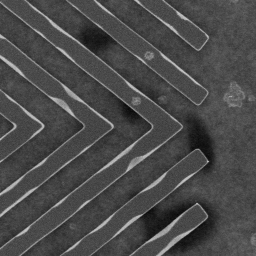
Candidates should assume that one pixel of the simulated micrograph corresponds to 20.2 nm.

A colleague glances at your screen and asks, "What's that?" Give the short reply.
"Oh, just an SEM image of groups of lines, slits or small figures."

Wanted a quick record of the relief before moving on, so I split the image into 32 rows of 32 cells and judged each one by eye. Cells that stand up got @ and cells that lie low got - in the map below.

@@@@-----@@@-----@@@@-----------
-@@@@-----@@@@-----@@@----------
---@@@-----@@@@-----@@@@--------
----@@@------@@@-----@@@@-------
-----@@@@-----@@@-----@@@@------
@@-----@@@-----@@@@-----@@------
@@@-----@@@-----@@@@------------
-@@@-----@@@@-----@@@-----------
--@@@-----@@@@-----@@@----------
---@@@-----@@@@-----@@@@--------
----@@@@-----@@@-----@@@@-------
-----@@@@-----@@@------@@@------
@------@@@-----@@@@-----@-------
@@@-----@@@-----@@@@------------
@@@@-----@@@@-----@@@-----------
--@@@-----@@@@-----@@@@---------
-@@@@-----@@@------@@@----------
@@@@-----@@@-----@@@@-----------
@@-----@@@@-----@@@@------------
@-----@@@@-----@@@-----@@@------
-----@@@------@@@-----@@@@------
----@@@-----@@@@-----@@@@-------
--@@@@-----@@@@-----@@@---------
-@@@@-----@@@------@@@----------
@@@-----@@@@-----@@@@-----------
@@-----@@@@-----@@@@------------
@-----@@@@-----@@@-----@@@------
-----@@@-----@@@@-----@@@@------
----@@@-----@@@------@@@--------
--@@@@-----@@@------@@@---------
-@@@------@@@-----@@@-----------
@@@-----@@@@-----@@@------------